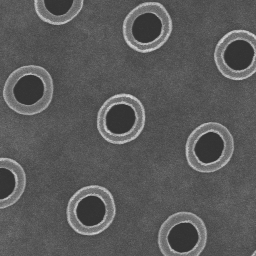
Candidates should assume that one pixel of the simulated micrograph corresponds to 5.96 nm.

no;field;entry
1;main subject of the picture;ring-shaped raised bodies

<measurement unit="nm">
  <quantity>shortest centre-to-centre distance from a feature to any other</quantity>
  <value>571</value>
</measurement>